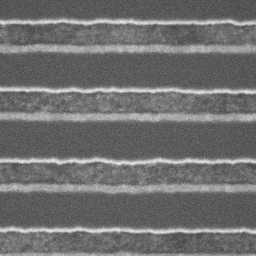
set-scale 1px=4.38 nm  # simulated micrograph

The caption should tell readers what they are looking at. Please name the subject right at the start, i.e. lines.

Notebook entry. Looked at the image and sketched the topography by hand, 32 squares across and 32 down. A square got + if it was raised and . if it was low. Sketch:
++++++++++++++++++++++++++++++++
++++++++++++++++++++++++++++++++
++++++++++++++++++++++++++++++++
................................
................................
................................
++++++++++++++++++++++++++++++++
++++++++++++++++++++++++++++++++
++++++++++++++++++++++++++++++++
++++++++++++++++++++++++++++++++
++++++++++++++++++++++++++++++++
...........+...........++++.++++
................................
................................
+++.+...........................
++++++++++++++++++++++++++++++++
++++++++++++++++++++++++++++++++
++++++++++++++++++++++++++++++++
++++++++++++++++++++++++++++++++
++++++++++++++++++++++++++++++++
................+...............
................................
................................
++++++++++++++.+..++++++++++++++
++++++++++++++++++++++++++++++++
++++++++++++++++++++++++++++++++
++++++++++++++++++++++++++++++++
++++++++++++++++++++++++++++++++
++++++++++++++++++++++++++++++++
................................
................................
................................